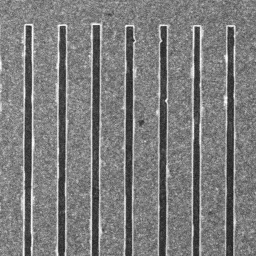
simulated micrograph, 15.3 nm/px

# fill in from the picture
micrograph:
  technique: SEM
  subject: parallel lines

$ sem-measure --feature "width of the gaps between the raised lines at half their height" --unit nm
117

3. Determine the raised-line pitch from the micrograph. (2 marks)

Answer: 516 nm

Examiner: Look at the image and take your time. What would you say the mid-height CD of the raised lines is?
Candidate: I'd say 0.403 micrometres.